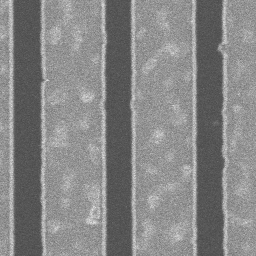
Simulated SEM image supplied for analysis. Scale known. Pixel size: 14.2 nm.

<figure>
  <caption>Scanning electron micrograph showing one or a few lines or trenches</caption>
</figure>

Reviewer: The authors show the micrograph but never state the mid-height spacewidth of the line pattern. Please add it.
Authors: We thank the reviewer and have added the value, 846 nm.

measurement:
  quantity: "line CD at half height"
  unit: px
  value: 31.9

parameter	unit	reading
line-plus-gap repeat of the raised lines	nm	1300